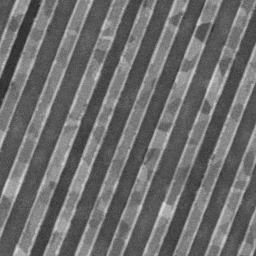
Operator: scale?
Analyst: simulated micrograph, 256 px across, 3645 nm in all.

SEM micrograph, parallel lines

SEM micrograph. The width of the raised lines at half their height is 189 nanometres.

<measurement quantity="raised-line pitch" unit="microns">0.43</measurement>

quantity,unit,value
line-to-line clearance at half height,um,0.24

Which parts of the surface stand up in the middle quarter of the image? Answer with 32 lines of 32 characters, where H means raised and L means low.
HLLLLLHHHHLLLHHHHLLLLHHHHLLLLHHH
LLLLLLHHHLLLLHHHLLLLLHHHLLLLLHHH
LLLLLHHHHLLLLHHHLLLLLHHHLLLLHHHH
LLLLLHHHLLLLHHHHLLLLHHHHLLLLHHHH
LLLLHHHHLLLLHHHLLLLLHHHLLLLLHHHL
LLLLHHHHLLLHHHHLLLLHHHHLLLLHHHHL
LLLLHHHLLLLHHHLLLLLHHHLLLLLHHHHL
LLLHHHHLLLLHHHLLLLLHHHLLLLLHHHLL
LLLHHHLLLLHHHHLLLLHHHHLLLLHHHHLL
LLHHHHLLLLHHHLLLLLHHHLLLLLHHHHLL
LLHHHHLLLHHHHLLLLLHHHLLLLHHHHLLL
LLHHHLLLLHHHHLLLLHHHLLLLLHHHHLLL
LHHHHLLLLHHHLLLLLHHHLLLLLHHHLLLL
LHHHLLLLLHHHLLLLHHHHLLLLHHHHLLLL
LHHHLLLLHHHLLLLLHHHLLLLLHHHHLLLL
HHHHLLLHHHHLLLLLHHHLLLLHHHHLLLLL
HHHLLLLHHHLLLLLHHHLLLLLHHHHLLLLL
HHHLLLLHHHLLLLLHHHLLLLLHHHLLLLLL
HHHLLLHHHHLLLLHHHHLLLLHHHHLLLLLH
HHLLLLHHHLLLLLHHHLLLLLHHHHLLLLLH
HHLLLLHHHLLLLLHHHLLLLHHHHLLLLLLH
HHLLLHHHLLLLLHHHHLLLLHHHHLLLLLHH
HLLLLHHHLLLLLHHHLLLLLHHHLLLLLLHH
HLLLLHHHLLLLHHHHLLLLHHHHLLLLLHHH
LLLLHHHLLLLLHHHLLLLLHHHLLLLLLHHH
LLLLHHHLLLLLHHHLLLLHHHHLLLLLLHHH
LLLHHHHLLLLHHHHLLLLHHHHLLLLLHHHH
LLLHHHLLLLLHHHLLLLLHHHLLLLLLHHHL
LLLHHHLLLLHHHHLLLLHHHHLLLLLHHHHL
LLHHHHLLLLHHHLLLLLHHHHLLLLLHHHLL
LLHHHLLLLLHHHLLLLLHHHLLLLLLHHHLL
LHHHHLLLLHHHHLLLLHHHHLLLLLHHHLLL